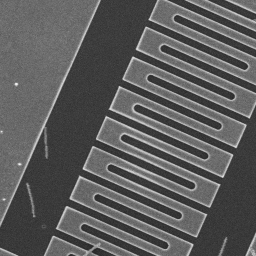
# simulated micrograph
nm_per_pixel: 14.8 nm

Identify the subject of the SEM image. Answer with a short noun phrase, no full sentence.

groups of lines, slits or small figures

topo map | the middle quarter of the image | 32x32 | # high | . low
##..............######.....#####
#...............#########....###
#..............############....#
...............######...#####...
................######....######
..................######....####
.............###....######.....#
.............#####....######....
.............########....######.
............###########....#####
............#####...#####.....##
............#####.....#####.....
..............#####.....#####...
................#####.....#####.
..........####.....#####.....###
.........#######.....#####.....#
.........#########.....#####....
.........###########.....#####..
........######...#####.....#####
..........#####.....#####.....##
............#####.....#####.....
.......##.....#####.....#####...
......######.....####......#####
......########.....####.....####
......##########......####.....#
.....######..#####.....#####....
.....######.....####......#####.
.......######.....####......####
....#.....#####.....#####.....##
...####.....#####.....#####.....
...#######....#####......#####..
..##########.....#####.....#####